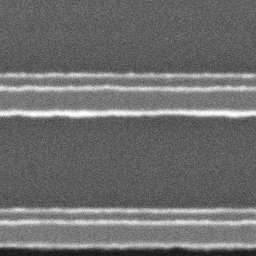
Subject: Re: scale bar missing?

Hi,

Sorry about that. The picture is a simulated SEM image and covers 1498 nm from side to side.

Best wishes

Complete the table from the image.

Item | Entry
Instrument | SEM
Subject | lines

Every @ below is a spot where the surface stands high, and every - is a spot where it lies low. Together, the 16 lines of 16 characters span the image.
----------------
----------------
----------------
----------------
----------------
@@@@@@@@@@@@@@@@
@@@@@@@@@@@@@@@@
----------------
----------------
----------------
----------------
----------------
----------------
@@@@@@@@@@@@@@@@
@@@@@@@@@@@@@@@@
----------------